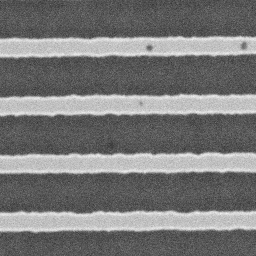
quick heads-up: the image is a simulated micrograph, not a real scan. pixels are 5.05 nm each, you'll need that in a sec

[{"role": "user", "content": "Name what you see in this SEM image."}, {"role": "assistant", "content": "lines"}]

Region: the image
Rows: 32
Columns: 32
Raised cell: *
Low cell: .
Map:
................................
................................
................................
................................
................................
********************************
********************************
................................
................................
................................
................................
................................
********************************
********************************
................................
................................
................................
................................
................................
...*****************************
********************************
*************..*.**.**..........
................................
................................
................................
................................
............*....*...*..*.*...**
********************************
********************************
................................
................................
................................